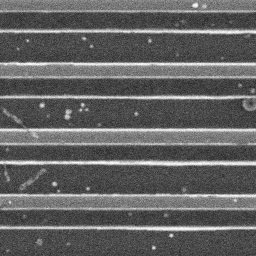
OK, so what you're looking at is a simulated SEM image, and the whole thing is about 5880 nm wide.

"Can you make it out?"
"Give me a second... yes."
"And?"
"lines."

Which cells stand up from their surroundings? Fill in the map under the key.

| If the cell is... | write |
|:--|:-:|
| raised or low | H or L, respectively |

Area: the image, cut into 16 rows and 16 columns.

HHHHHHHHHHHHHHHH
HHHHHHHHHHHHHHHH
LLLLLLLLLLLLLLLL
LLLLLLLLLLLLLLLL
HHHHHHHHHHHHHHHH
HHHHHHHHHHHHHHHH
LLLLLLLLLLLLLLLL
LLLLLLLLLLLLLLLL
HHHHHHHHHHHHHHHH
HHHHHHHHHHHHHHHH
LLLLLLLLLLLLLLLL
LLLLLLLLLLLLLLLL
HHHHHHHHHHHHHHHH
HHHHHHHHHHHHHHHH
LLLLLLLLLLLLLLLL
LLLLLLLLLLLLLLLL